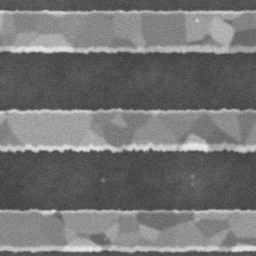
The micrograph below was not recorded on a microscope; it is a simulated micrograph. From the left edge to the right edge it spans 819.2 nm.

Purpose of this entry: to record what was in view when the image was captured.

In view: lines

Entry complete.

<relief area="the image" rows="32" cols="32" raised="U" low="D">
DDDDDDDDDDDDDDDDDDDDDDDDDDDDDDDD
UUUUUUUUDUDUUUUUUUUUUUUUUUUUUUUU
UUUUUUUUUUUUUUUUUUUUUUUUUUUUUUUU
UUUUUUUUUUUUUUUUUUUUUUUUUUUUUUUU
UUUUUUUUUUUUUUUUUUUUUUUUUUUUUUUU
UUUUUUUUUUUUUUUUUUUUUUUUUUUUUUUU
DDDDDDDDDUUDDDDDDUDDDDUDDDUUUUDD
DDDDDDDDDDDDDDDDDDDDDDDDDDDDDDDD
DDDDDDDDDDDDDDDDDDDDDDDDDDDDDDDD
DDDDDDDDDDDDDDDDDDDDDDDDDDDDDDDD
DDDDDDDDDDDDDDDDDDDDDDDDDDDDDDDD
DDDDDDDDDDDDDDDDDDDDDDDDDDDDDDDD
DDDDDDDDDDDDDDDDDDDDDDDDDDDDDDDD
DDDDDDDDDDDDDDDDDDDDDDDDDDDDDDDD
UUUUUUUUUUUUUUUUUUUUUUUUUUUUUUUU
UUUUUUUUUUUUUUUUUUUUUUUUUUUUUUUU
UUUUUUUUUUUUUUUUUUUUUUUUUUUUUUUU
UUUUUUUUUUUUUUUUUUUUUUUUUUUUUUUU
UUUUUUUUUUUUUUUUUUUUUUUUUUUUUUUU
DDDDDDDDDDDDDDDDDDDDDDDDDDDDDDDD
DDDDDDDDDDDDDDDDDDDDDDDDDDDDDDDD
DDDDDDDDDDDDDDDDDDDDDDDDDDDDDDDD
DDDDDDDDDDDDDDDDDDDDDDDDDDDDDDDD
DDDDDDDDDDDDDDDDDDDDDDDDDDDDDDDD
DDDDDDDDDDDDDDDDDDDDDDDDDDDDDDDD
DDDDDDDDDDDDDDDDDDDDDDDDDDDDDDDD
UUUUUUUUUUUUUUUUUUUUUUUUUUUUUUUU
UUUUUUUUUUUUUUUUUUUUUUUUUUUUUUUU
UUUUUUUUUUUUUUUUUUUUUUUUUUUUUUUU
UUUUUUUUUUUUUUUUUUUUUUUUUUUUUUUU
UUUUUUUUUUUUUUUUUUUUUUUUUUUUUUUU
DDDDDDDDDDDDDDDDUDDDDDDDDDDDDDDD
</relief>